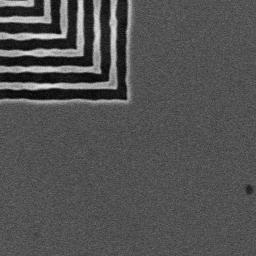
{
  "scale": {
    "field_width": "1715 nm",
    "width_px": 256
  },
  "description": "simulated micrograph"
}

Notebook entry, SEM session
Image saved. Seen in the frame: groups of lines, slits or small figures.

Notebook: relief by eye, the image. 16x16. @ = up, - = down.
--------@@@@@@@@
--------@@@@@@@@
--------@@@@@@@@
--------@@@@@@@@
--------@@@@@@@@
--------@@@@@@@@
@@@@@@@@@@@@@@@@
@@@@@@@@@@@@@@@@
@@@@@@@@@@@@@@@@
@@@@@@@@@@@@@@@@
@@@@@@@@@@@@@@@@
@@@@@@@@@@@@@@@@
@@@@@@@@@@@@@@@@
@@@@@@@@@@@@@@@@
@@@@@@@@@@@@@@@@
@@@@@@@@@@@@@@@@